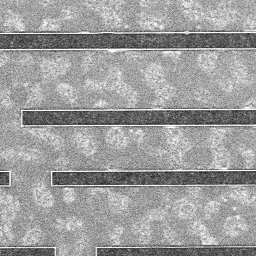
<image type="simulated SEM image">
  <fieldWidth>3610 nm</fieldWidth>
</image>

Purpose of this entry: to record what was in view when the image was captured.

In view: one or a few lines or trenches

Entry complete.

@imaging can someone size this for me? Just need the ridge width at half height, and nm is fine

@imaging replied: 226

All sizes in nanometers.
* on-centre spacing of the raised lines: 982